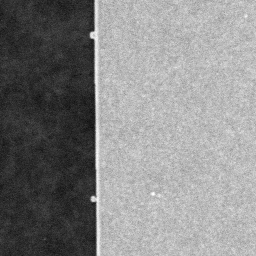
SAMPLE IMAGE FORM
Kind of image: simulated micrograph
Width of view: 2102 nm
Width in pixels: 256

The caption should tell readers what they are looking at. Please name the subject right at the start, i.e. wiring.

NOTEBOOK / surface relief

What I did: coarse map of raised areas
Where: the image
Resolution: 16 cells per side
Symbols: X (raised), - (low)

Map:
------XXXXXXXXXX
------XXXXXXXXXX
------XXXXXXXXXX
------XXXXXXXXXX
------XXXXXXXXXX
------XXXXXXXXXX
------XXXXXXXXXX
------XXXXXXXXXX
------XXXXXXXXXX
------XXXXXXXXXX
------XXXXXXXXXX
------XXXXXXXXXX
------XXXXXXXXXX
------XXXXXXXXXX
------XXXXXXXXXX
------XXXXXXXXXX